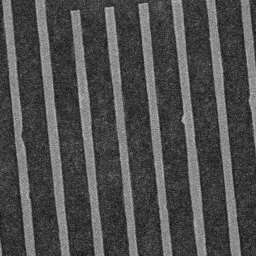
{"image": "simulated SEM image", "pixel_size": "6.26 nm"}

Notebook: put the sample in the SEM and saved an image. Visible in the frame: parallel lines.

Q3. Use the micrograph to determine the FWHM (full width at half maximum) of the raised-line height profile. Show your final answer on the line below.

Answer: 52.9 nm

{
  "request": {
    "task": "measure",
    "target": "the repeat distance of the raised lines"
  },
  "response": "0.213 microns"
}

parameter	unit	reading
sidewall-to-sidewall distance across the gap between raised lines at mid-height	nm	160